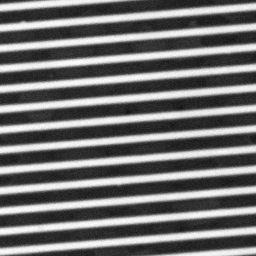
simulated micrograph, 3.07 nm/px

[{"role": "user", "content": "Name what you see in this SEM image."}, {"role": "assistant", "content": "parallel lines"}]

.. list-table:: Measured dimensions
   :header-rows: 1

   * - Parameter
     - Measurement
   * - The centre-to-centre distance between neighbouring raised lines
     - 62.3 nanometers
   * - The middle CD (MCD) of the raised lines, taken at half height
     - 19.9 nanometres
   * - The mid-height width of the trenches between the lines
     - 42.5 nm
